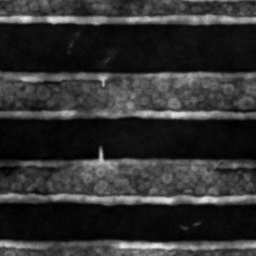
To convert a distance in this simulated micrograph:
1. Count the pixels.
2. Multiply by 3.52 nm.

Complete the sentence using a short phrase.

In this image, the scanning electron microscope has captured one or a few lines or trenches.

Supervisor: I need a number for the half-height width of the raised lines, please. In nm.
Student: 147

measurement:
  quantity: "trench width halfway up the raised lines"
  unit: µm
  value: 0.161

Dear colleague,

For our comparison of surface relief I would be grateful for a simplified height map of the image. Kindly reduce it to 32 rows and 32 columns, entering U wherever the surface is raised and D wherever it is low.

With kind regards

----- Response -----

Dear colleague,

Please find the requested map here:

UUUUUUUUUUUUUUUUUUUUUUUUUUUUUUUU
UUUUUUUUUUUUUUUUUUUUUUUUUUUUUUUU
UUUUUUUUUUUUUUUUUUUUUUUUUUUUUUUU
DDDDDDDDDDDDDDDDDDDDDDDDDDDDDDDD
DDDDDDDDDDDDDDDDDDDDDDDDDDDDDDDD
DDDDDDDDDDDDDDDDDDDDDDDDDDDDDDDD
DDDDDDDDDDDDDDDDDDDDDDDDDDDDDDDD
DDDDDDDDDDDDDDDDDDDDDDDDDDDDDDDD
DDDDDDDDDDDDDDDDDDDDDDDDDDDDDDDD
UUUUUUUUUUUUUUUUUUUUUUUUUUUUUUUU
UUUUUUUUUUUUUUUUUUUUUUUUUUUUUUUU
UUUUUUUUUUUUUUUUUUUUUUUUUUUUUUUU
UUUUUUUUUUUUUUUUUUUUUUUUUUUUUUUU
UUUUUUUUUUUUUUUUUUUUUUUUUUUUUUUU
UDDDDDDUDDDDDDDDDDDDDUUUUUUUUUUU
DDDDDDDDDDDDDDDDDDDDDDDDDDDDDDDD
DDDDDDDDDDDDDDDDDDDDDDDDDDDDDDDD
DDDDDDDDDDDDDDDDDDDDDDDDDDDDDDDD
DDDDDDDDDDDDDDDDDDDDDDDDDDDDDDDD
DDDDDDDDDDDDDDDDDDDDDDDDDDDDDDDD
UUUUUUUUUUUUUUUUUUUUUUUUUUUUUUUU
UUUUUUUUUUUUUUUUUUUUUUUUUUUUUUUU
UUUUUUUUUUUUUUUUUUUUUUUUUUUUUUUU
UUUUUUUUUUUUUUUUUUUUUUUUUUUUUUUU
UUUUUUUUUUUUUUUUUUUUUUUUUUUUUUUU
DDDDDDDDDDDDDDDDDDDDDDDDDDDDDDDD
DDDDDDDDDDDDDDDDDDDDDDDDDDDDDDDD
DDDDDDDDDDDDDDDDDDDDDDDDDDDDDDDD
DDDDDDDDDDDDDDDDDDDDDDDDDDDDDDDD
DDDDDDDDDDDDDDDDDDDDDDDDDDDDDDDD
UUUUUUDDDUUUUUUUUUUUUDDDDDDUUUUU
UUUUUUUUUUUUUUUUUUUUUUUUUUUUUUUU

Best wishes